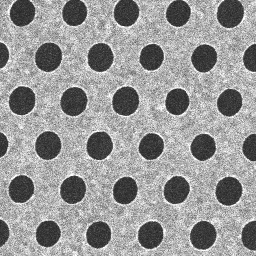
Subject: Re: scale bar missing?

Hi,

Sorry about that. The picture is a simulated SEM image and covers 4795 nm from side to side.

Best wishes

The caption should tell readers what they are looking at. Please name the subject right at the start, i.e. a regular array of holes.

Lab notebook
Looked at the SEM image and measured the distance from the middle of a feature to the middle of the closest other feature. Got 953 nm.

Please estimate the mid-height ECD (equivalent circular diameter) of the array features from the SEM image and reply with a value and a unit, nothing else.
509 nanometers